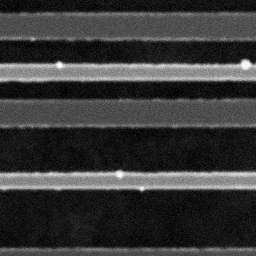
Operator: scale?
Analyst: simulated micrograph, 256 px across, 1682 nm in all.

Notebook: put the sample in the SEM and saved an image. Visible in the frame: lines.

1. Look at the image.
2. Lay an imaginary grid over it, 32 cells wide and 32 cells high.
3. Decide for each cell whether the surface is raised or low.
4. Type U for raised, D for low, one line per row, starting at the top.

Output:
DDDDDDDDDDDDDDDDDDDDDDDDDDDDDDDD
DDDDDDDDDDDDDDDDDDDDDDDDDDDDDDDD
UUUUUUUUUUUUUUUUUUUUUUUUUUUUUUUU
UUUUUUUUUUUUUUUUUUUUUUUUUUUUUUUU
UUUUUUUUUUUUUUUUUUUUUUUUUUUUUUUU
DDDDDDDDDDDDDDDDDDDDDDDDDDDDDDDD
DDDDDDDDDDDDDDDDDDDDDDDDDDDDDDDD
DDDDDDDDDDDDDDDDDDDDDDDDDDDDDDDD
UUUUUUUUUUUUUUUUUUUUUUUUUUUUUUUU
UUUUUUUUUUUUUUUUUUUUUUUUUUUUUUUU
DDDDDDDDDDDDDDDDDDDDDDDDDDDDDDDD
DDDDDDDDDDDDDDDDDDDDDDDDDDDDDDDD
DDDDDDDDDDDDDDDUUDDUDDUUUUUUUUUU
UUUUUUUUUUUUUUUUUUUUUUUUUUUUUUUU
UUUUUUUUUUUUUUUUUUUUUUUUUUUUUUUU
UUUUUUUUUUUUUUUUUUUUUUUUUUUUUUUU
DDDDDDDDDDDDDDDDDDDDDDDDDDDDDDDD
DDDDDDDDDDDDDDDDDDDDDDDDDDDDDDDD
DDDDDDDDDDDDDDDDDDDDDDDDDDDDDDDD
DDDDDDDDDDDDDDDDDDDDDDDDDDDDDDDD
DDDDDDDDDDDDDDDDDDDDDDDDDDDDDDDD
DDDDDDDDDDDDDDDDDDDDDDDDDDDDDDDD
UUUUUUUUUUUUUUUUUUUUUUUUUUUUUUUU
UUUUUUUUUUUUUUUUUUUUUUUUUUUUUUUU
DDDDDDDDDDDDDDDDDDDDDDDDDDDDDDDD
DDDDDDDDDDDDDDDDDDDDDDDDDDDDDDDD
DDDDDDDDDDDDDDDDDDDDDDDDDDDDDDDD
DDDDDDDDDDDDDDDDDDDDDDDDDDDDDDDD
DDDDDDDDDDDDDDDDDDDDDDDDDDDDDDDD
DDDDDDDDDDDDDDDDDDDDDDDDDDDDDDDD
DDDDDDDDDDDDDDDDDDDDDDDDDDDDDDDD
UUUUUUUUUUUUUUUUUUUUUUUUUUUUUUUU